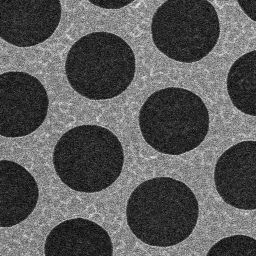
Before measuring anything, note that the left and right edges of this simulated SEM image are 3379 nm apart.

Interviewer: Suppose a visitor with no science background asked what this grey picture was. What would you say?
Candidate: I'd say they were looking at holes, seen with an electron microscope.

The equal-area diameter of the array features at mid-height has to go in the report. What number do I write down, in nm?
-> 924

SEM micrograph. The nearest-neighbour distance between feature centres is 1.21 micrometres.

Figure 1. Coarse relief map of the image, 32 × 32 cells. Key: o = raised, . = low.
........oooo....oooo......oooo..
........ooooooooooo........ooo..
........ooooooooooo........oooo.
.......oooooooooooo........ooooo
......oooo.....oooo........ooooo
o....oooo.......ooo........ooooo
ooooooooo........ooo......ooooo.
oooooooo.........ooooo...ooooo..
oooooooo.........oooooooooooo...
....oooo.........ooooooooooo....
.....oooo.......oooooooooooo....
......oooo.....oooo.....oooo....
......oooooo.ooooo.......oooo...
......oooooooooooo........ooo...
......ooooooooooo.........oooooo
.....oooooooooooo.........oooooo
....oooo......oooo........oooooo
ooooooo........ooo.......ooooooo
ooooooo........oooo.....ooooo...
ooooooo.........oooooooooooo....
..ooooo........oooooooooooo.....
....ooo........oooooooooooo.....
....oooo.......ooo....ooooo.....
.....oooo....oooo.......ooo.....
.....ooooooooooo........ooo.....
.....ooooooooooo.........ooo....
....oooooooooooo.........ooooooo
...ooooo...ooooo.........ooooooo
ooooooo......ooo........oooooooo
oooooo........ooo.......ooooo..o
oooooo........oooo....ooooo.....
oooooo........oooooooooooo......